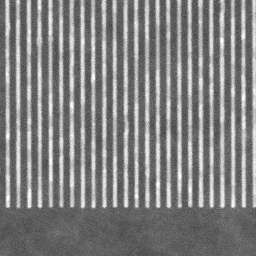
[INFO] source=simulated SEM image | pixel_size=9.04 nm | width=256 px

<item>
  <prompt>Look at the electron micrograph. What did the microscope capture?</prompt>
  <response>parallel lines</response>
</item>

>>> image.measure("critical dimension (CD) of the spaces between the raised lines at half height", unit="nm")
69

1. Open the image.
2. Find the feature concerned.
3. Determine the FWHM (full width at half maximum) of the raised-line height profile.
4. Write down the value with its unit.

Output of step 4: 24.9 nm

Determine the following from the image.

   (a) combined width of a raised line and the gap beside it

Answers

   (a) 0.097 micrometres